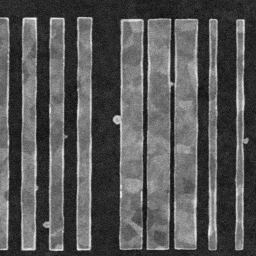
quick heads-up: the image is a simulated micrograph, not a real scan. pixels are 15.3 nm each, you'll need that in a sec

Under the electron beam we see groups of lines, slits or small figures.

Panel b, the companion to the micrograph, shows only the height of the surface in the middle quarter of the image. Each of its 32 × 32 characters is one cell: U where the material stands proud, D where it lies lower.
DDDDUUUDDDDDDDUUUUUDDUUUUUDDUUUU
DDDDUUUDDDDDDDUUUUUDDUUUUUDDUUUU
DDDDUUUDDDDDDDUUUUUDDUUUUUDDUUUU
DDDDUUUDDDDDDDUUUUUDDUUUUUDDUUUU
DDDDUUUDDDDDDDUUUUUDDUUUUUDDUUUU
DDDDUUUDDDDDDDUUUUUDDUUUUUDDUUUU
DDDDUUUDDDDDDDUUUUUDDUUUUUDDUUUU
DDDDUUUDDDDDDDUUUUUUDUUUUUDDUUUU
DDDDUUDDDDDDDDUUUUUUDUUUUUDDUUUU
DDDDUUDDDDDDDDUUUUUUDUUUUUDDUUUU
DDDDUUDDDDDDDDUUUUUUDUUUUUDDUUUU
DDDDUUDDDDDDDDUUUUUDDUUUUUDDUUUU
DDDDUUDDDDDDDDUUUUUDDUUUUUDDUUUU
DDDDUUDDDDDDUUUUUUUUDUUUUUDDUUUU
DDDDUUDDDDDDUUUUUUUUDUUUUUDDUUUU
DDDDUUDDDDDDDDUUUUUDDUUUUUDDUUUU
DDDDUUDDDDDDDDUUUUUDDUUUUUDDUUUU
DDDDUUDDDDDDDDUUUUUUDUUUUUDDUUUU
DDDDUUDDDDDDDDUUUUUUDUUUUUDDUUUU
DDDDUUDDDDDDDDUUUUUUDUUUUUDDUUUU
DDDDUUDDDDDDDDUUUUUUDUUUUUDDUUUU
DDDDUUDDDDDDDDUUUUUDDUUUUUDDUUUU
DDDDUUDDDDDDDDUUUUUDDUUUUUDDUUUU
DDDDUUDDDDDDDDUUUUUDDUUUUUDDUUUU
DDDDUUDDDDDDDDUUUUUDDUUUUUDDUUUU
DDDDUUDDDDDDDDUUUUUUDUUUUUDDUUUU
DDDDUUDDDDDDDDUUUUUUDUUUUUDDUUUU
DDDDUUDDDDDDDDUUUUUUDUUUUUDDUUUU
DDDDUUDDDDDDDDUUUUUUDUUUUUDDUUUU
DDDDUUDDDDDDDDUUUUUUDUUUUUDDUUUU
DDDDUUDDDDDDDDUUUUUDDUUUUUDDUUUU
DDDDUUDDDDDDDDUUUUUDDUUUUUDDUUUU